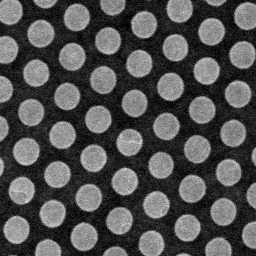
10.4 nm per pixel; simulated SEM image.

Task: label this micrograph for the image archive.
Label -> a regular array of raised bodies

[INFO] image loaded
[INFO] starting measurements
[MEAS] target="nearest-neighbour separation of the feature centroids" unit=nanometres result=404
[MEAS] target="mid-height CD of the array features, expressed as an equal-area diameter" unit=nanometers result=271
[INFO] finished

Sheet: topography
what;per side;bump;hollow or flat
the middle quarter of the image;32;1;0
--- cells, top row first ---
11110000000000001111110000000000
01000000111100001111110000000000
00000001111110000111100000110000
00000001111110000000000011111000
00000001111110000000000011111100
11100001111110000000000111111100
11100000111100000000000011111100
11110000000000001111000011111000
11110000000000011111000001110000
11100000000000011111100000000000
11100000000000011111100000000001
00000011111000011111000000000001
00000011111000001110000001000000
00000111111100000000000111110000
00000111111100000000000111111000
11000011111000000000000111111000
11100011110000011000000111111000
11100000000000111110000111110000
11100000000001111110000011100000
11000000000001111110000000000001
10000011000001111110000000000011
00000111110000111110000000000011
00001111110000011100000111000011
00001111110000000000001111100001
00001111110000000000011111100000
10000111110000000000011111100000
10000011100000111000011111100000
10000000000001111100001111000000
10000000000011111100000000000011
10000000000011111100000000000111
00000111000011111100000000000111
00001111100001111100000000000111